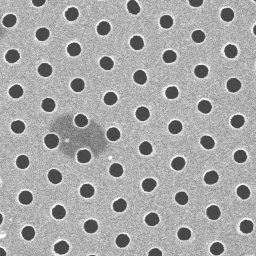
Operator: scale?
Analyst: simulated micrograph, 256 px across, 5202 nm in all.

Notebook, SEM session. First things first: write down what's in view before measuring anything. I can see a regular array of holes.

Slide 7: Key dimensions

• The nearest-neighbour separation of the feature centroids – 712 nm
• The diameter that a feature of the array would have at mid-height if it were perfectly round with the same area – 290 nm